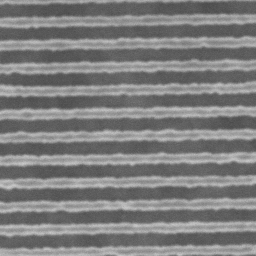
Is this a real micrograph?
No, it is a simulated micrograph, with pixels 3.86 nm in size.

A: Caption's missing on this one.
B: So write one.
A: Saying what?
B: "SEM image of parallel lines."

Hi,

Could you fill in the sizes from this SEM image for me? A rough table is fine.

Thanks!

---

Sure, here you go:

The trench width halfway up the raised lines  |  0.0555 µm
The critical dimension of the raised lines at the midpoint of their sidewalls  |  33.3 nanometers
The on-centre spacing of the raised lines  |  89.2 nm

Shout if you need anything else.